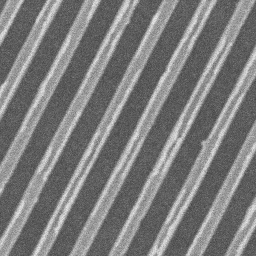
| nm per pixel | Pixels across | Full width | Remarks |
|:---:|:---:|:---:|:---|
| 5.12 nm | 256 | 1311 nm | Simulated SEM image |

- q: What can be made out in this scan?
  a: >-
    parallel lines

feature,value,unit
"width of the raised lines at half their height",0.0638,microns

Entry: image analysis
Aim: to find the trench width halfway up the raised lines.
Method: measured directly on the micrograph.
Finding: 0.112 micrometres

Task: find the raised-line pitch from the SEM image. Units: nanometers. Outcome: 176